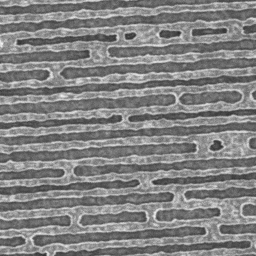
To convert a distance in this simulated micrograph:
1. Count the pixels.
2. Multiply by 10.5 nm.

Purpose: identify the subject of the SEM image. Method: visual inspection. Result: parallel lines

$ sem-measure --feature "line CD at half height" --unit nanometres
70.8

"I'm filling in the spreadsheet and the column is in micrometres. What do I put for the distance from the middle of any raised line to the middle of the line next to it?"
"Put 0.173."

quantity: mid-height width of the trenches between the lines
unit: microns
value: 0.097